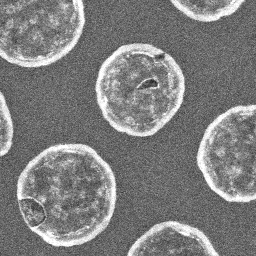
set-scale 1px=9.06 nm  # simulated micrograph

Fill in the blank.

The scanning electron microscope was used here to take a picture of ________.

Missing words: raised bodies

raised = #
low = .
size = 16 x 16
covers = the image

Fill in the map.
#####......####.
#####...........
#####...........
####...###......
......#####.....
......#####.....
......#####.....
#......###....##
#............###
...###.......###
..#####......###
.######......###
..#####.........
...####.........
...###....##....
........#####...